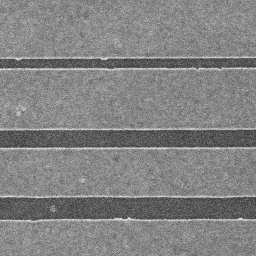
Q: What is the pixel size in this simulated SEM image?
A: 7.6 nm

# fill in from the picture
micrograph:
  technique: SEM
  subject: one or a few lines or trenches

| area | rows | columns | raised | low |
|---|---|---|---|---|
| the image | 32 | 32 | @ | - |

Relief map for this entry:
@@@@@@@@@@@@@@@@@@@@@@@@@@@@@@@@
@@@@@@@@@@@@@@@@@@@@@@@@@@@@@@@@
@@@@@@@@@@@@@@@@@@@@@@@@@@@@@@@@
@@@@@@@@@@@@@@@@@@@@@@@@@@@@@@@@
@@@@@@@@@@@@@@@@@@@@@@@@@@@@@@@@
@@@@@@@@@@@@@@@@@@@@@@@@@@@@@@@@
@@@@@@@@@@@@@@@@@@@@@@@@@@@@@@@@
--------------------------------
--------------------------------
@@@@@@@@@@@@@@@@@@@@@@@@@@@@@@@@
@@@@@@@@@@@@@@@@@@@@@@@@@@@@@@@@
@@@@@@@@@@@@@@@@@@@@@@@@@@@@@@@@
@@@@@@@@@@@@@@@@@@@@@@@@@@@@@@@@
@@@@@@@@@@@@@@@@@@@@@@@@@@@@@@@@
@@@@@@@@@@@@@@@@@@@@@@@@@@@@@@@@
@@@@@@@@@@@@@@@@@@@@@@@@@@@@@@@@
--------------------------------
--------------------------------
--------------------------@@@@@@
@@@@@@@@@@@@@@@@@@@@@@@@@@@@@@@@
@@@@@@@@@@@@@@@@@@@@@@@@@@@@@@@@
@@@@@@@@@@@@@@@@@@@@@@@@@@@@@@@@
@@@@@@@@@@@@@@@@@@@@@@@@@@@@@@@@
@@@@@@@@@@@@@@@@@@@@@@@@@@@@@@@@
@@@@@@@@@@@@@@@@@@@@@@@@@@@@@@@-
--------------------------------
--------------------------------
-------@@@@@@@@@@@------@@@--@@-
@@@@@@@@@@@@@@@@@@@@@@@@@@@@@@@@
@@@@@@@@@@@@@@@@@@@@@@@@@@@@@@@@
@@@@@@@@@@@@@@@@@@@@@@@@@@@@@@@@
@@@@@@@@@@@@@@@@@@@@@@@@@@@@@@@@